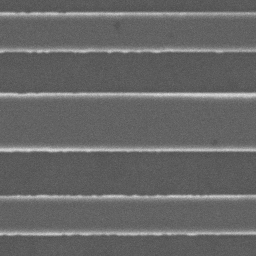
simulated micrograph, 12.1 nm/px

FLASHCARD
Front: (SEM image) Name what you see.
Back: lines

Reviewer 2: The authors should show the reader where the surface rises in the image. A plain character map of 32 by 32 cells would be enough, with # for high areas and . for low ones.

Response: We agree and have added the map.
................................
................................
################################
################################
################################
################################
................................
................................
................................
................................
................................
................................
################################
################################
################################
################################
################################
################################
################################
................................
................................
................................
................................
................................
..#####..###.#####.#.###########
################################
################################
################################
################################
................................
................................
................................